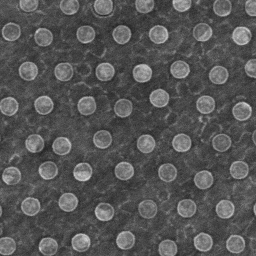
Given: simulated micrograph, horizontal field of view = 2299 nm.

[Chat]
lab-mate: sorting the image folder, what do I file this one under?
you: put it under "a regular array of raised bodies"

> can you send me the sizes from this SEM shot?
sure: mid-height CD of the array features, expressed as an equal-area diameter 18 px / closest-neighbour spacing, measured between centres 315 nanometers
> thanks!